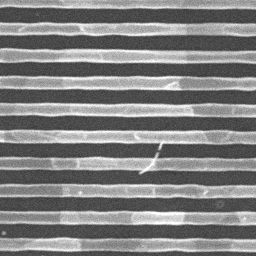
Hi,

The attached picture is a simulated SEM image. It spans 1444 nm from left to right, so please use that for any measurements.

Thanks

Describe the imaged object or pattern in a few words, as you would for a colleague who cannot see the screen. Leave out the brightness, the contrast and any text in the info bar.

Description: wiring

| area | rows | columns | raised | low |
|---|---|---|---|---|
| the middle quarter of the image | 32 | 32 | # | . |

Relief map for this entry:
................................
................................
................................
............########......######
################################
################################
................................
................................
................................
................................
##########################....##
################################
....############################
................................
................................
................................
................................
################################
################################
####....#......#################
................................
................................
................................
.......................#........
################################
################################
....................#......#####
................................
................................
................................
##########..################.###
################################